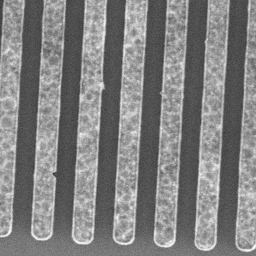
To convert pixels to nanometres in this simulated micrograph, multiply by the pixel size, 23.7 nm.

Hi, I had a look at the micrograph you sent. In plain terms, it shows parallel lines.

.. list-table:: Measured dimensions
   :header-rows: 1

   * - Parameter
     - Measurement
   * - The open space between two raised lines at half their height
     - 486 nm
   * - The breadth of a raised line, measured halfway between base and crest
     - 0.486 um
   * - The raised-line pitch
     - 970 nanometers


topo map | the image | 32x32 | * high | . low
.**...**...**...**...**...***..*
***..***...**...**...**...***..*
***..***...**...**...**...**...*
***..***...**...**...**...**...*
***..***...**...**...**...**...*
***..***..***..***...**...**...*
***..***..***..***...**...**...*
***..***..***..***...**...**...*
***..***..***..***...**...**...*
**...***..***..***..***...**...*
**...***..***..***..***...**...*
**...**...***..***..***..***...*
**...**...***..***..***..***..**
**...**...**...***..***..***..**
**...**...**...***..***..***..**
**...**...**...***..***..***..**
**...**...**...**...***..***..**
**...**...**...**...***..***..**
**...**...**...**...**...***..**
**...**...**...**...**...***..**
**..***...**...**...**...**...**
**..***...**...**...**...**...**
**..***..***...**...**...**...**
**..***..***..***...**...**...**
**..***..***...**...**...**...**
**..***..***..***...**...**...**
**..***..***..***...**...**...**
*...***..***..***..***...**...**
*...***..***..***..***..***...**
*...**...***..***..***..***...**
....................**..***...**
................................